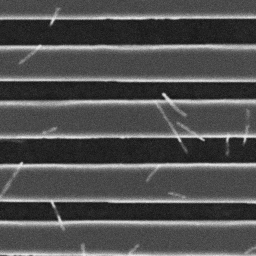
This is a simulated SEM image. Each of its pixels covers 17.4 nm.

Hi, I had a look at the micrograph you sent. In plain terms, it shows lines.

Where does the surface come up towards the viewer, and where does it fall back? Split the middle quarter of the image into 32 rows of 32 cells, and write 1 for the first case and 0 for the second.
11111111111111111111111111111111
11111111111111111111111111111111
11111111111111111111111111111111
11111111111111111111111111111111
00000000000000000000000000000000
00000000000000000000000000000000
00000000000000000000000000000000
00000000000000000000000000000000
00000000000000000000000001000000
00111111111111111111111111111111
11111111111111111111111111111111
11111111111111111111111111111111
11111111111111111111111111111111
11111111111111111111111111111111
11111111111111111111111111111111
11111111111111111111111111111111
11111111111111111111111111111111
11111111111111111111111111111111
00000000000000000000000000001100
00000000000000000000000000000000
00000000000000000000000000000000
00000000000000000000000000000000
00000000000000000000000000000000
00000000000000000000000000000000
00000000000000000000000000000000
11111111111111111111111111111111
11111111111111111111111111111111
11111111111111111111111111111111
11111111111111111111111111111111
11111111111111111111111111111111
11111111111111111111111111111111
11111111111111111111111111111111